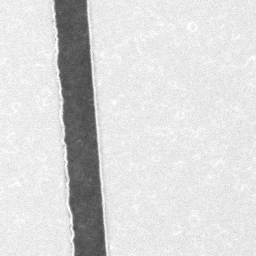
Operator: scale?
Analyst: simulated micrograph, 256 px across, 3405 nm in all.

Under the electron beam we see one or a few lines or trenches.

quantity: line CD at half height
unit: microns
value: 0.473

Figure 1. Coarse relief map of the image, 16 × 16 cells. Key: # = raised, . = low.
...###..........
...###..........
....##..........
....##..........
....##..........
....##..........
....##..........
....##..........
....##..........
....##..........
....##..........
....##..........
....##..........
....###.........
....###.........
.....##.........